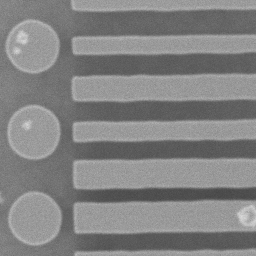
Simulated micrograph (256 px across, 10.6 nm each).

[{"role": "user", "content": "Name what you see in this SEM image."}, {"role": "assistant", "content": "groups of lines, slits or small figures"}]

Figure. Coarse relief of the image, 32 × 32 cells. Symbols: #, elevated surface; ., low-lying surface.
.........#######################
................................
................................
..####..........................
.######................#########
.######..#######################
.######..######################.
.######.........................
..####..........................
.................##...##########
.........#######################
.........#######################
..........#######....##.........
...##...........................
..#####.........................
.######..#######################
.######..#######################
.######..###########............
..#####.........................
...###..........................
.........#######################
.........#######################
.........#######################
..........####..................
...###..........................
..#####...######################
.#######.#######################
.#######.#######################
.######..#######################
..#####.........................
....#...........................
..........######################